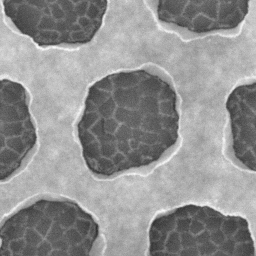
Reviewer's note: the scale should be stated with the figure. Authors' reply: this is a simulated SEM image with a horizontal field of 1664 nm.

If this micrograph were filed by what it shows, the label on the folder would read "holes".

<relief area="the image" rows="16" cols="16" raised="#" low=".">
.......###......
#.....####.....#
##....##########
################
########..######
..####.....####.
..###......###..
..###......###..
..###......###..
..###......###..
.#####..#######.
################
##...###########
......####.....#
......###.......
......###.......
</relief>